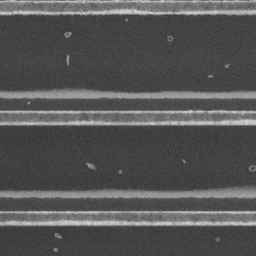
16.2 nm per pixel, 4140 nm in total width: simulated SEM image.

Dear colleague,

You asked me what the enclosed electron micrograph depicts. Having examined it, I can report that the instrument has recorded lines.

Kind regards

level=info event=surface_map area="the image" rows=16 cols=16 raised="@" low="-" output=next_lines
@@@@@@@@@@@@@@@@
----------------
----------------
----------------
----------------
----------------
@@@@@@@@@@@@@@@@
@@@@@@@@@@@@@@@@
----------------
----------------
----------------
----------------
@@@@@@@@@@@@@@@@
@@@@@@@@@@@@@@@@
----------------
----------------